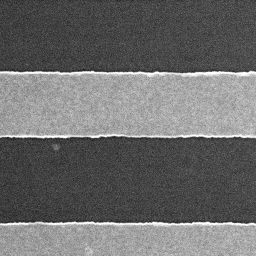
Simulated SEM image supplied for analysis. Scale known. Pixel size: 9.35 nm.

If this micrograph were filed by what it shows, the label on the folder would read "one or a few lines or trenches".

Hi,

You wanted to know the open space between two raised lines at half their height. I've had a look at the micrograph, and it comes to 810 nanometres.